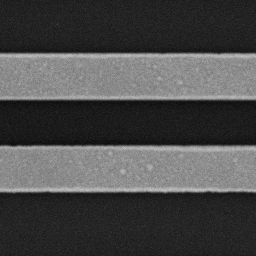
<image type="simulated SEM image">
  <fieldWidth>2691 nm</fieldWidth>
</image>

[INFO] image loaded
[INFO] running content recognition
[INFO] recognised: lines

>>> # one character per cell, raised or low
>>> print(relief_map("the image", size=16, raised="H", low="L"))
LLLLLLLLLLLLLLLL
LLLLLLLLLLLLLLLL
LLLLLLLLLLLLLLLL
HHHHHHHHHHHHHHHH
HHHHHHHHHHHHHHHH
HHHHHHHHHHHHHHHH
LLLLLLLLLLLLLLLL
LLLLLLLLLLLLLLLL
LLLLLLLLLLLLLLLL
HHHHHHHHHHHHHHHH
HHHHHHHHHHHHHHHH
HHHHHHHHHHHHHHHH
LLLLLLLLLLLLLLLL
LLLLLLLLLLLLLLLL
LLLLLLLLLLLLLLLL
LLLLLLLLLLLLLLLL